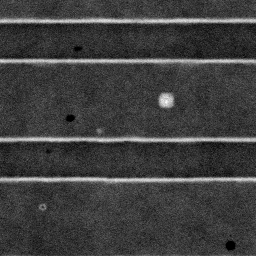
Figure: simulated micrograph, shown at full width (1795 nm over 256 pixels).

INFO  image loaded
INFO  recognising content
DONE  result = wiring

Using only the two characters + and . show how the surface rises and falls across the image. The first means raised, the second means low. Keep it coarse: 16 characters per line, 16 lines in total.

++++++++++++++++
................
................
................
++++++++++++++++
++++++++++++++++
++++++++++++++++
++++++++++++++++
++++++++++++++++
................
................
++++++++++++++++
++++++++++++++++
++++++++++++++++
++++++++++++++++
++++++++++++++++